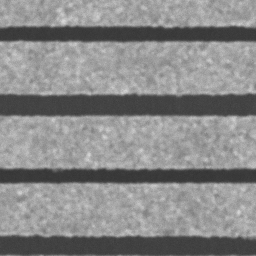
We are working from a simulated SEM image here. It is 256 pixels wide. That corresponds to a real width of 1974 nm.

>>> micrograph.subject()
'lines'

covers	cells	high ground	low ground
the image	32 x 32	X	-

XXXXXXXXXXXXXXXXXXXXXXXXXXXXXXXX
XXXXXXXXXXXXXXXXXXXXXXXXXXXXXXXX
XXXXXXXXXXXXXXXXXXXXXXXXXXXXXXXX
--------------------------------
--------------------------------
XXXXXXXXXXXXXXXXXXXXXXXXXXXXXXXX
XXXXXXXXXXXXXXXXXXXXXXXXXXXXXXXX
XXXXXXXXXXXXXXXXXXXXXXXXXXXXXXXX
XXXXXXXXXXXXXXXXXXXXXXXXXXXXXXXX
XXXXXXXXXXXXXXXXXXXXXXXXXXXXXXXX
XXXXXXXXXXXXXXXXXXXXXXXXXXXXXXXX
XXXXXXXXXXXXXXXXXXXXXXXXXXXXXXXX
--------------------------------
--------------------------------
--------------------------------
XXXXXXXXXXXXXXXXXXXXXXXXXXXXXXXX
XXXXXXXXXXXXXXXXXXXXXXXXXXXXXXXX
XXXXXXXXXXXXXXXXXXXXXXXXXXXXXXXX
XXXXXXXXXXXXXXXXXXXXXXXXXXXXXXXX
XXXXXXXXXXXXXXXXXXXXXXXXXXXXXXXX
XXXXXXXXXXXXXXXXXXXXXXXXXXXXXXXX
--------------------------------
--------------------------------
XXXXXXXXXXXXXXXXXXXXXXXXXXXXXXXX
XXXXXXXXXXXXXXXXXXXXXXXXXXXXXXXX
XXXXXXXXXXXXXXXXXXXXXXXXXXXXXXXX
XXXXXXXXXXXXXXXXXXXXXXXXXXXXXXXX
XXXXXXXXXXXXXXXXXXXXXXXXXXXXXXXX
XXXXXXXXXXXXXXXXXXXXXXXXXXXXXXXX
--------------X--------------XX-
--------------------------------
--------------------------------